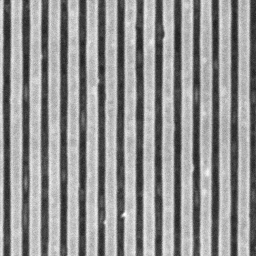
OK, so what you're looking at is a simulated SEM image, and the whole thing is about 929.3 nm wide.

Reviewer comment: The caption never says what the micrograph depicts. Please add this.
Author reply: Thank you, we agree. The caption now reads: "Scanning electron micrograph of parallel lines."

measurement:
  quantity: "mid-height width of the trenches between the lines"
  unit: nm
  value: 30.9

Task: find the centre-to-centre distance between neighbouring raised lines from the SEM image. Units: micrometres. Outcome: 0.0689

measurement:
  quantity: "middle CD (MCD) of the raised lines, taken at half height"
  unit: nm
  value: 37.2